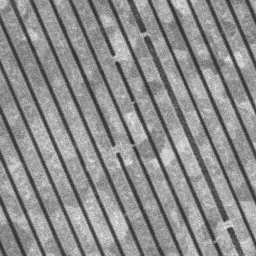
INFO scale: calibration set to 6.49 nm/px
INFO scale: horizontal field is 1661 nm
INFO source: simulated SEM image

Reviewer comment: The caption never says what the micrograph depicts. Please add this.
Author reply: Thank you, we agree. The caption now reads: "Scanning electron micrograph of parallel lines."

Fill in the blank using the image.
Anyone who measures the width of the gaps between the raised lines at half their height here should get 31.3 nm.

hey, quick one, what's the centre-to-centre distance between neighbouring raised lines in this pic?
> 18 px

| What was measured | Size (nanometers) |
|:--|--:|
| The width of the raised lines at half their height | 87.8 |